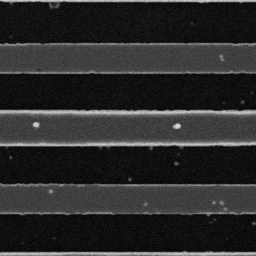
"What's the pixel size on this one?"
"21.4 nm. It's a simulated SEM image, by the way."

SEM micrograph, lines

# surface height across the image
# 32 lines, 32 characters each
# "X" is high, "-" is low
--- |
--------------------------------
--------------------------------
--------------------------------
--------------------------------
--------------------------------
---X--XXXXXXXXX-XXXXXXXXXXXXX-X-
XXXXXXXXXXXXXXXXXXXXXXXXXXXXXXXX
XXXXXXXXXXXXXXXXXXXXXXXXXXXXXXXX
XXXXXXXXXXXXXXXXXXXXXXXXXXXXXXXX
--------------------------------
--------------------------------
--------------------------------
--------------------------------
--------------------------------
XXXXXXXXXXXXXXXXXXXXXXXXXXXXXXXX
XXXXXXXXXXXXXXXXXXXXXXXXXXXXXXXX
XXXXXXXXXXXXXXXXXXXXXXXXXXXXXXXX
XXXXXXXXXXXXXXXXXXXXXXXXXXXXXXXX
--------------------------------
--------------------------------
--------------------------------
--------------------------------
--------------------------------
XXXXXXXXXXXXXXXXXXXXXXXXXXXXXXXX
XXXXXXXXXXXXXXXXXXXXXXXXXXXXXXXX
XXXXXXXXXXXXXXXXXXXXXXXXXXXXXXXX
XXXXXXXXXXXXXXXXXXXXXXXXXXXXXXXX
--------------------------------
--------------------------------
--------------------------------
--------------------------------
--------------------------------